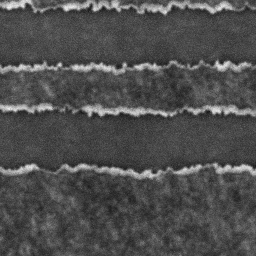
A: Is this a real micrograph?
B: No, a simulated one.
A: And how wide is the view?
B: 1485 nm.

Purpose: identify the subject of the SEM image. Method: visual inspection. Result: one or a few lines or trenches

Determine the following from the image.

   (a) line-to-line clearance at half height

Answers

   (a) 329 nanometres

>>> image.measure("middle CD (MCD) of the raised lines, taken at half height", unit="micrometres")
0.272